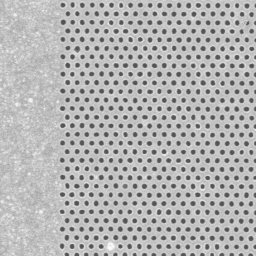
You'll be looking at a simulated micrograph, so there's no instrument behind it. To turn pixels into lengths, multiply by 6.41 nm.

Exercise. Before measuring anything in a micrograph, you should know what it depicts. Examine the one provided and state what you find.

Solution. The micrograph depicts a regular array of holes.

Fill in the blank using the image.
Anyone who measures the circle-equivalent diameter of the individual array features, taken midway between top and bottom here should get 0.0298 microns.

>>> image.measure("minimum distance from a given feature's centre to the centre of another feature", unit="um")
0.0603